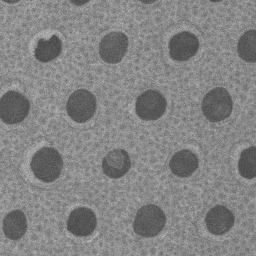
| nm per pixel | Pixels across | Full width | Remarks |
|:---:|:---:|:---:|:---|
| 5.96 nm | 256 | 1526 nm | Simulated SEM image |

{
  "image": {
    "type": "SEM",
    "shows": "a regular array of holes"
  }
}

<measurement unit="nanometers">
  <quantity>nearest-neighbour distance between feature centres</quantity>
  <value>394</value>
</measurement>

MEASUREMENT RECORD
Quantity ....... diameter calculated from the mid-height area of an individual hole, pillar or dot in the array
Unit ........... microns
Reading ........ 0.184